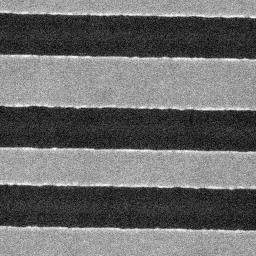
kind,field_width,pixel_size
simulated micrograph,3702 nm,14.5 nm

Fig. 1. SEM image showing lines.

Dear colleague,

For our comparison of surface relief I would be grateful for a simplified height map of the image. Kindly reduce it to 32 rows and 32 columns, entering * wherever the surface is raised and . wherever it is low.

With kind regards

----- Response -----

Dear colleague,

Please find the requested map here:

********************************
********************************
................................
................................
................................
................................
................................
*******************************.
********************************
********************************
********************************
********************************
********************************
..................*.************
................................
................................
................................
................................
................................
********************************
********************************
********************************
********************************
........................********
................................
................................
................................
................................
*********.......................
********************************
********************************
********************************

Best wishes